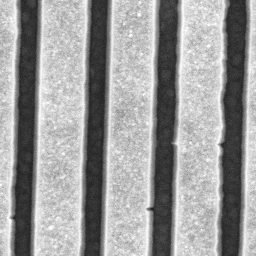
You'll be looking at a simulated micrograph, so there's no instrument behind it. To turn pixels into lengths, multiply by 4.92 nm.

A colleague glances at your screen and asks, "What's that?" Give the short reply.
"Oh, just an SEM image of one or a few lines or trenches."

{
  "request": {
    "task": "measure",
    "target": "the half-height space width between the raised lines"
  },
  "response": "112 nanometres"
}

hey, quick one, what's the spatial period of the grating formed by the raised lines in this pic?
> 340 nm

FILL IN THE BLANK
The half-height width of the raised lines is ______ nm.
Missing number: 227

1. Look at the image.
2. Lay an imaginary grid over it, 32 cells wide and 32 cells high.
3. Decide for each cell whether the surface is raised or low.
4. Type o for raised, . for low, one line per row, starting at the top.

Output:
oo...oooooo...oooooo...ooooo...o
oo...oooooo...ooooo....ooooo...o
oo...oooooo...ooooo....ooooo...o
oo...oooooo...oooooo...ooooo...o
oo...oooooo...ooooo....ooooo...o
oo...oooooo...ooooo....ooooo...o
oo...oooooo...ooooo...oooooo...o
oo...oooooo...ooooo...oooooo...o
oo...oooooo...ooooo...oooooo...o
oo...oooooo...ooooo...oooooo...o
oo...oooooo...ooooo...oooooo...o
oo...oooooo...ooooo...oooooo...o
oo...oooooo...ooooo...oooooo...o
oo...oooooo...ooooo...oooooo...o
oo...oooooo..oooooo...oooooo...o
oo...oooooo..oooooo...oooooo...o
oo...ooooo...oooooo...oooooo...o
oo...ooooo...oooooo...oooooo...o
oo...ooooo...oooooo...ooooo....o
oo...ooooo...oooooo...ooooo....o
oo...ooooo...oooooo...ooooo....o
oo...ooooo...oooooo...ooooo....o
oo...ooooo...oooooo...ooooo....o
o...oooooo...oooooo...ooooo....o
o...oooooo...oooooo...oooooo...o
o...oooooo...oooooo...ooooo....o
o...oooooo...oooooo...ooooo...oo
o...oooooo...oooooo...ooooo...oo
o...oooooo...oooooo...ooooo...oo
o...oooooo...oooooo...ooooo...oo
o...oooooo...oooooo...ooooo...oo
o...oooooo...oooooo...ooooo...oo